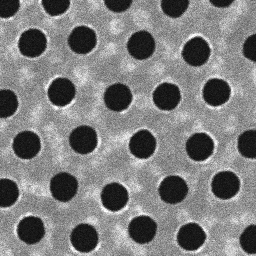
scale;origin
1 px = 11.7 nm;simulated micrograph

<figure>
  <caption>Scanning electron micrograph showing a regular array of holes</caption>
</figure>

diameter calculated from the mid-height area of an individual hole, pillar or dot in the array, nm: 343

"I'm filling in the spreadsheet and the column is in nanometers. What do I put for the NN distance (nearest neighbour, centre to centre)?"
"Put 584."